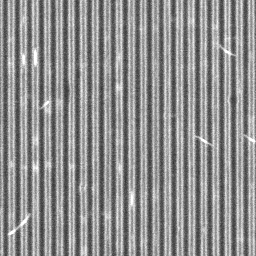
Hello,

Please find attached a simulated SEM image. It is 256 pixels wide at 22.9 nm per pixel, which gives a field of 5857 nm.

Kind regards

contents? parallel lines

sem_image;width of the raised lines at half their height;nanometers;194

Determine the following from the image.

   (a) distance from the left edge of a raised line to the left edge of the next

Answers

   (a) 275 nanometres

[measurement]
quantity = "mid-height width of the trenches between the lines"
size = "0.0858 µm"